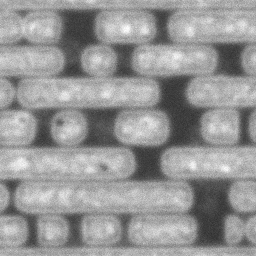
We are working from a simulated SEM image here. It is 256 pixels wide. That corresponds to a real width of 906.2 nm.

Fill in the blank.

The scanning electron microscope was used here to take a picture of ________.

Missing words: parallel lines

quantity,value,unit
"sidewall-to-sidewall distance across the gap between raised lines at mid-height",88.6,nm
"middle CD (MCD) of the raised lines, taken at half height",30.6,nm